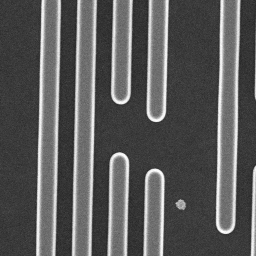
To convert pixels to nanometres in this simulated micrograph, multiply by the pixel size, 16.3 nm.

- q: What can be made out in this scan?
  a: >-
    groups of lines, slits or small figures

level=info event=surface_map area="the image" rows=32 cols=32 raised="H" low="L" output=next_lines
LLLLLHHLLLHHLLHHLLLHHLLLLLLLHHLL
LLLLLHHLLLHHLLHHLLLHHLLLLLLLHHLL
LLLLLHHLLLHHLLHHLLLHHLLLLLLLHHLL
LLLLLHHLLLHHLLHHLLLHHLLLLLLLHHLL
LLLLLHHLLLHHLLHHLLLHHLLLLLLLHHLL
LLLLLHHLLLHHLLHHLLLHHLLLLLLLHHLL
LLLLLHHLLLHHLLHHLLLHHLLLLLLLHHLL
LLLLLHHLLLHHLLHHLLLHHLLLLLLLHHLL
LLLLLHHLLLHHLLHHLLLHHLLLLLLLHHLL
LLLLLHHLLLHHLLHHLLLHHLLLLLLLHHLL
LLLLLHHLLLHHLLHHLLLHHLLLLLLLHHLL
LLLLLHHLLLHHLLHHLLHHHLLLLLLLHHLL
LLLLLHHLLLHHLLHHLLHHHLLLLLLHHHLL
LLLLLHHLLLHHLLLLLLHHHLLLLLLHHHLL
LLLLLHHLLLHHLLLLLLLHLLLLLLLHHHLL
LLLLLHHLLHHHLLLLLLLLLLLLLLLHHHLL
LLLLLHHLLHHHLLLLLLLLLLLLLLLHHHLL
LLLLLHHLLHHHLLLLLLLLLLLLLLLHHHLL
LLLLLHHLLHHHLLLLLLLLLLLLLLLHHLLL
LLLLLHHLLHHHLLHHLLLLLLLLLLLHHLLL
LLLLLHHLLHHLLLHHLLLLLLLLLLLHHLLL
LLLLLHHLLHHLLLHHLLLHLLLLLLLHHLLL
LLLLLHHLLHHLLLHHLLHHLLLLLLLHHLLL
LLLLLHHLLHHLLLHHLLHHLLLLLLLHHLLL
LLLLLHHLLHHLLLHHLLHHLLLLLLLHHLLL
LLLLLHHLLHHLLLHHLLHHLLLLLLLHHLLL
LLLLLHHLLHHLLLHHLLHHLLLLLLLHHLLL
LLLLLHHLLHHLLLHHLLHHLLLLLLLHHLLL
LLLLLHHLLHHLLLHHLLHHLLLLLLLHHLLL
LLLLLHHLLHHLLLHHLLHHLLLLLLLLLLLL
LLLLLHHLLHHLLLHHLLHHLLLLLLLLLLLL
LLLLLHHLLHHLLLHHLLHHLLLLLLLLLLLH